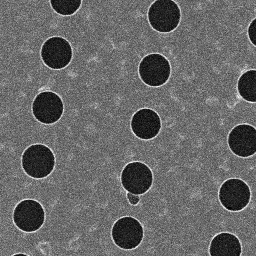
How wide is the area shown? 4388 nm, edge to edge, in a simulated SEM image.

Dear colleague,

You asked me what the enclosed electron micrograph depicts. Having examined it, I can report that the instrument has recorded a regular array of holes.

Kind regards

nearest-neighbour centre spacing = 939 nm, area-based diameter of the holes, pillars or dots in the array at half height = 0.551 microns